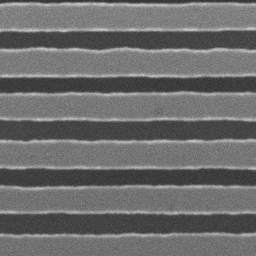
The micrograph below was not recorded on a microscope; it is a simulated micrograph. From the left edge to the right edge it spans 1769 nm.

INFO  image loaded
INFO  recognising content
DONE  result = lines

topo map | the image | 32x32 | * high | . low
******.*********.......*******.*
********************************
********************************
********************************
................................
................................
********************************
********************************
********************************
***************...*******.**....
................................
................................
********************************
********************************
********************************
................................
................................
............................*..*
********************************
********************************
********************************
................................
................................
********************************
********************************
********************************
********************************
................................
................................
********************************
********************************
********************************